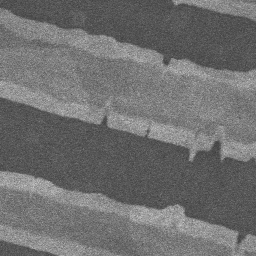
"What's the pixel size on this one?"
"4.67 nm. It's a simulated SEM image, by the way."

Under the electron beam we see one or a few lines or trenches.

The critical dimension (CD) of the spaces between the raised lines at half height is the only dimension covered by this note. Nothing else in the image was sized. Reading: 375 nm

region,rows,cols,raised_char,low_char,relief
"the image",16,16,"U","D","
DDDDDDDDDDDDDDUU
UDDDDDDDDDDDDDDD
UUUUUDDDDDDDDDDD
UUUUUUUUUUDDDDDD
UUUUUUUUUUUUUDDD
UUUUUUUUUUUUUUUU
DDDUUUUUUUUUUUUU
DDDDDDDUUUUUUUUU
DDDDDDDDDDUUUUUU
DDDDDDDDDDDDDDUU
DDDDDDDDDDDDDDDD
UUDDDDDDDDDDDDDD
UUUUUUDDDDDDDDDD
UUUUUUUUUUUDDDDD
UUUUUUUUUUUUUUDD
DDDUUUUUUUUUUUUU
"